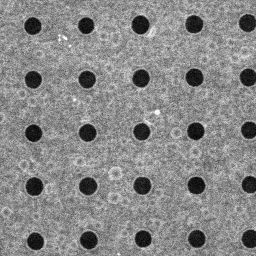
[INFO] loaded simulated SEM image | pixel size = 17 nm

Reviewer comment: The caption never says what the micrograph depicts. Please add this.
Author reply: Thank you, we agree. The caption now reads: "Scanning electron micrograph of a regular array of holes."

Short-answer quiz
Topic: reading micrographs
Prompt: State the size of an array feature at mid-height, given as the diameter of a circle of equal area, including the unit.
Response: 313 nm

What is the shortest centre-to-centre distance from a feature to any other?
0.908 microns